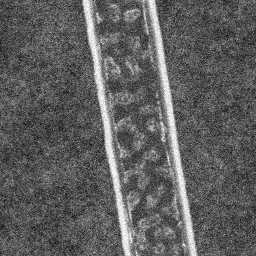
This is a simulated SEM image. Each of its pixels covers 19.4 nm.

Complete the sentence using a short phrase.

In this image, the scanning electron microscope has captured one or a few lines or trenches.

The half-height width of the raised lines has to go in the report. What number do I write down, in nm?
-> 1290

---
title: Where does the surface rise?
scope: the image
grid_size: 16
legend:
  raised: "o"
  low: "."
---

.....ooooo......
......oooo......
......oooo......
......oooo......
......oooo......
......oooo......
......ooooo.....
.......oooo.....
.......oooo.....
.......oooo.....
.......oooo.....
.......oooo.....
.......ooooo....
........oooo....
........oooo....
........oooo....